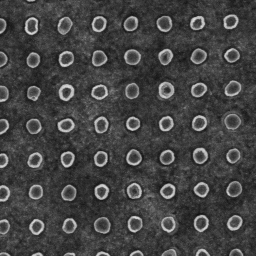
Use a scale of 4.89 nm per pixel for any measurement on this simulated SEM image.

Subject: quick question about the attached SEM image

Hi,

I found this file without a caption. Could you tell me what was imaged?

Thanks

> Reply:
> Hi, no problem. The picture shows a regular array of raised bodies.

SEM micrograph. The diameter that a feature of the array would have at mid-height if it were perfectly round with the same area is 70.4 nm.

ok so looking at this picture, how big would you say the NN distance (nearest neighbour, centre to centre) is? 160 nm